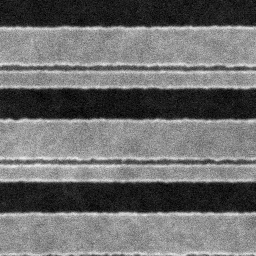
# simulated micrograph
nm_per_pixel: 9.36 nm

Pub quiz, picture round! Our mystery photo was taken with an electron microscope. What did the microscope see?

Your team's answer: lines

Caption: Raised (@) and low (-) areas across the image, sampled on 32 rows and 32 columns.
--------------------------------
--------------------------------
--------------------------------
@@@@---@@@@@@-@@-@@@@@@@@@@@@@@@
@@@@@@@@@@@@@@@@@@@@@@@@@@@@@@@@
@@@@@@@@@@@@@@@@@@@@@@@@@@@@@@@@
@@@@@@@@@@@@@@@@@@@@@@@@@@@@@@@@
@@@@@@@@@@@@@@@@@@@@@@@@@@@@@@@@
@@@@@@@@@@@@@@@@@@@@@@@@@@@@@@@@
@@@@@@@@@@@@@@@@@@@@@@@@@@@@@@@@
@@@@@@@@@@@@@@@@@@@@@@@@@@@@@@@@
--------------------------------
--------------------------------
--------------------------------
--------------------------------
@@@@@@@@@@@@@@@@@@@@@@@@@@@@@@@@
@@@@@@@@@@@@@@@@@@@@@@@@@@@@@@@@
@@@@@@@@@@@@@@@@@@@@@@@@@@@@@@@@
@@@@@@@@@@@@@@@@@@@@@@@@@@@@@@@@
@@@@@@@@@@@@@@@@@@@@@@@@@@@@@@@@
@@@@@@@@@@@@@@@@@@@@@@@@@@@@@@@@
@@@@@@@@@@@@@@@@@@@@@@@@@@@@@@@@
@@@@@@@@@@@@@@@@@@@@@@@@@@@@@@@@
--------------------------------
--------------------------------
--------------------------------
--------------------------------
@@@@@@@@@@@@@@@@@@@@@@@@@@@@@@@@
@@@@@@@@@@@@@@@@@@@@@@@@@@@@@@@@
@@@@@@@@@@@@@@@@@@@@@@@@@@@@@@@@
@@@@@@@@@@@@@@@@@@@@@@@@@@@@@@@@
@@@@@@@@@@@@@@@@@@@@@@@@@@@@@@@@